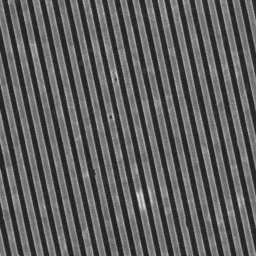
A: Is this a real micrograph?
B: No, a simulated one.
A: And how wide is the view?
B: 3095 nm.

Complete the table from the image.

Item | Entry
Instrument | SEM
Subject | parallel lines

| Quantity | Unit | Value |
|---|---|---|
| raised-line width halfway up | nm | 78.3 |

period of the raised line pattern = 148 nm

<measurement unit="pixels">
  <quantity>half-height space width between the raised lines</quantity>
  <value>5.99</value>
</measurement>